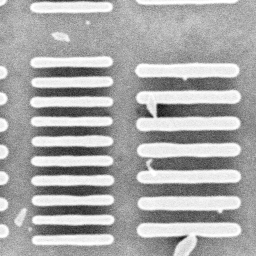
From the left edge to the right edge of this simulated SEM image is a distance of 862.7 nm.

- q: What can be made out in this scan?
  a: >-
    groups of lines, slits or small figures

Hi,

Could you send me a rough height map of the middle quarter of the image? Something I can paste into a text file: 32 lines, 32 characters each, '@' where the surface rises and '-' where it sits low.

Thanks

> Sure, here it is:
@@@@@@@@@@@--------@@@-----@@@@@
------------------@@@@@@@@@@@@@@
------------------@@@@@@@@@@@@@@
---@@@@@@@@---------------------
@@@@@@@@@@@@--------------------
@@@@@@@@@@----------------------
--------------------------------
-------------------@@@@@@@@@@@@@
@@@@@@@@@@@-------@@@@@@@@@@@@@@
@@@@@@@@@@@@-------@@@@@@@@@@@@@
@@-@@@@@-------------@@---------
---------------------@@---------
----------------------@---------
@@--@@@@@@@-----------@-------@@
@@@@@@@@@@@@------@@@@@@@@@@@@@@
------------------@@@@@@@@@@@@@@
-------------------@@@--@@@@@---
--------------------------------
@@@@@@@@@@@---------------------
@@@@@@@@@@@@--------------------
------@@-----------@@@@@@@@@@@@@
-------------------@@@@@@@@@@@@@
-------------------@@@@@@@@@@@@@
@@@@@@@@@@@@--------------------
@@@@@@@@@@@@--------------------
--------------------------------
--------------------------------
-------------------@@@@@@@@@@@@@
@@@@@@@@@@@@-------@@@@@@@@@@@@@
@@@@@@@@@@@@--------@@@@@----@@@
--------------------------------
--------------------------------